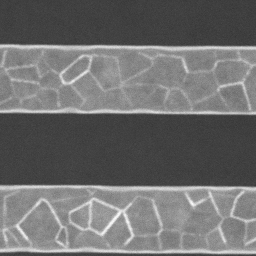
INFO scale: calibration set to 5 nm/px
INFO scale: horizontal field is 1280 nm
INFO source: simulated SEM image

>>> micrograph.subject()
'wiring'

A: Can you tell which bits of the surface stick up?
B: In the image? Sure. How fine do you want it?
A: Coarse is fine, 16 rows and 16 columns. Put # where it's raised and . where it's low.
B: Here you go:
................
................
................
################
################
################
################
................
................
................
................
................
################
################
################
################